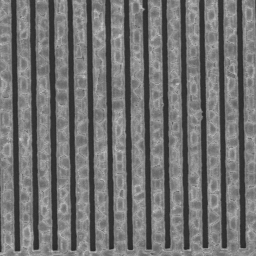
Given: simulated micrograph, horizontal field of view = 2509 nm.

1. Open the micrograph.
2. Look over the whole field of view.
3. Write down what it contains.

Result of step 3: parallel lines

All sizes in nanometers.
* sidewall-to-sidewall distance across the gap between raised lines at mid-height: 61.2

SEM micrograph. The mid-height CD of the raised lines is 125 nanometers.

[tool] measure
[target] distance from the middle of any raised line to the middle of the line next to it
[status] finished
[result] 184 nanometres